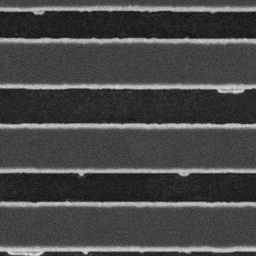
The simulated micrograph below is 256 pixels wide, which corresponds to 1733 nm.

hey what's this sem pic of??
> lines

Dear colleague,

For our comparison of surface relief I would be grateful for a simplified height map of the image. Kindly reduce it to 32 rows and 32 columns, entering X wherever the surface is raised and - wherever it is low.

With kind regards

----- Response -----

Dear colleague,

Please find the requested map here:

XXXXXXXXXXXXXXXXXXXXXXXXXXXXXXXX
--------------------------------
--------------------------------
--------------------------------
--------------------------------
XXXXXXXXXXXXXXXXXXXXXXXXXXXXXXXX
XXXXXXXXXXXXXXXXXXXXXXXXXXXXXXXX
XXXXXXXXXXXXXXXXXXXXXXXXXXXXXXXX
XXXXXXXXXXXXXXXXXXXXXXXXXXXXXXXX
XXXXXXXXXXXXXXXXXXXXXXXXXXXXXXXX
XXXXXXXXXXXXXXXXXXXXXXXXXXXXXXXX
--------------------------------
--------------------------------
--------------------------------
--------------------------------
--------------------------------
XXXXXXXXXXXXXXXXXXXXXXXXXXXXXXXX
XXXXXXXXXXXXXXXXXXXXXXXXXXXXXXXX
XXXXXXXXXXXXXXXXXXXXXXXXXXXXXXXX
XXXXXXXXXXXXXXXXXXXXXXXXXXXXXXXX
XXXXXXXXXXXXXXXXXXXXXXXXXXXXXXXX
----XXXXXXXXXXX-XX-XXXXXXXXX-XXX
--------------------------------
--------------------------------
--------------------------------
XXXXXXXXXXXXXXXXXXXXXXXXXXXXXXXX
XXXXXXXXXXXXXXXXXXXXXXXXXXXXXXXX
XXXXXXXXXXXXXXXXXXXXXXXXXXXXXXXX
XXXXXXXXXXXXXXXXXXXXXXXXXXXXXXXX
XXXXXXXXXXXXXXXXXXXXXXXXXXXXXXXX
XXXXXXXXXXXXXXXXXXXXXXXXXXXXXXXX
--------------------------------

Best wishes